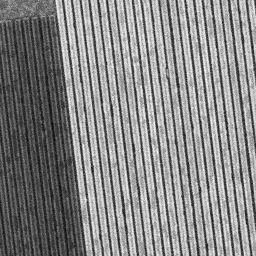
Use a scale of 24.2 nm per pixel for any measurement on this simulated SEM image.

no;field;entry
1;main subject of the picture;parallel lines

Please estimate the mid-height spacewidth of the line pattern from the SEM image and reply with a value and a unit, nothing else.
84.1 nm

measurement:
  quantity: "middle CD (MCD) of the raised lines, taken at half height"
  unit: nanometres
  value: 123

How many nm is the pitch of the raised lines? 210